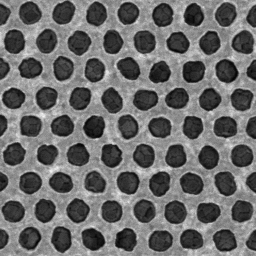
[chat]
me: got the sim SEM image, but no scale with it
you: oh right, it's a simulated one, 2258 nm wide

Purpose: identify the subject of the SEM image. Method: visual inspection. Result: a regular array of holes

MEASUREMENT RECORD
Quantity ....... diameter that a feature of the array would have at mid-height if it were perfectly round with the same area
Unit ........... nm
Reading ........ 204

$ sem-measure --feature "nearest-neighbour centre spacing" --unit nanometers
276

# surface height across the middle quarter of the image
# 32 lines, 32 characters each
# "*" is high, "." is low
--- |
...**.....***......***....****..
...**......***.....**......***..
..***.....****.....**......***..
..***.....*****...***.....****..
******..**************...******.
********************************
**.....***...*****....*****...**
**.....***....****.....***.....*
**.....**......**.......*......*
*......***.....**......**......*
**....****.....***.....***.....*
***..******...*****..***********
************.*******************
..****....***.....*****..*****..
..***.....***.....***......***..
...**.....***......**......**...
...**.....***......**......**...
..***.....****.....***.....***..
******...*****....*****..******.
********************************
**...*****...*****....****....**
*.....***.....****....****....**
*.....***.....***......***....**
*.....***.....***......**......*
*.....***.....****....***......*
***.*******..******...****...***
*******.************************
.*****...*****....*****...****..
..***.....***......***....***...
..***......**......**.....***...
..***......**......**.....***...
..****.....***....***.....****..